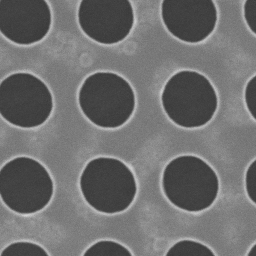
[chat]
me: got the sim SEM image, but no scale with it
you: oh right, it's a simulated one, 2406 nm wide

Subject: holes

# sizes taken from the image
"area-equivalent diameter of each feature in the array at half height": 0.524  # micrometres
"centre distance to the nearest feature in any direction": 775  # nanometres